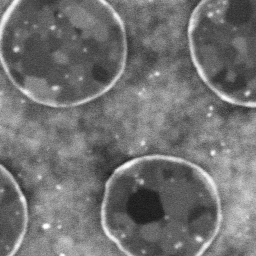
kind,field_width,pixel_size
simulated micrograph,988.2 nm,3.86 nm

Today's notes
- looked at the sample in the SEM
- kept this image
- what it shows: raised bodies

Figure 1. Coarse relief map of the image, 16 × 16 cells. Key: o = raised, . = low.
.oooooo.....oooo
oooooooo....oooo
oooooooo....oooo
oooooooo....oooo
oooooooo....oooo
.oooooo......ooo
...oo..........o
................
................
................
.......ooooo....
o......oooooo...
oo....oooooooo..
oo....oooooooo..
oo.....ooooooo..
o.......ooooo...